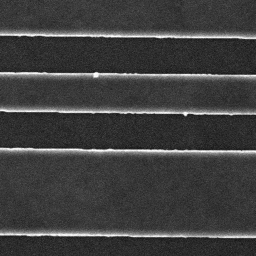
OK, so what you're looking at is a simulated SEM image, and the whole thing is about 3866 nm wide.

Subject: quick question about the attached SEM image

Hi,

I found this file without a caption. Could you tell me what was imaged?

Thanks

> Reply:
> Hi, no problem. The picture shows lines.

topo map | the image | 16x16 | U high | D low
UUUUUUUUUUUUUUUU
UUUUUUUUUUUUUUUU
DDDDDDDDDDDDDDDD
DDDDDDDDDDDDDDDD
DDDDDDDDDDDDDDDD
UUUUUUUUUUUUUUUU
UUUUUUUUUUUUUUUU
DDDDDDDDDDDDDDDD
DDDDDDDDDDDDDDDD
UUUUUUUUUUUUUUUU
UUUUUUUUUUUUUUUU
UUUUUUUUUUUUUUUU
UUUUUUUUUUUUUUUU
UUUUUUUUUUUUUUUU
UUUUUUUUUUUUUUUU
DDDDDDDDDDDDDDDD